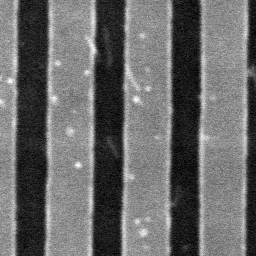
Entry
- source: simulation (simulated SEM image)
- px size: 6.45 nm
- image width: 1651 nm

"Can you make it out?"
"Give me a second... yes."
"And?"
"lines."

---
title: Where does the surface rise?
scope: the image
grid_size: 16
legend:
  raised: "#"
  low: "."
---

#..###..###..##.
#..###..###..##.
#..###..###..##.
#..###..###..##.
#..###..###..##.
#..###..###..##.
#..###..###..##.
#..###..###..##.
#..###..###..##.
#..###..###..##.
#..###..###..##.
#..###..###..##.
#..###..###..##.
#..###..###..##.
#..###..###..##.
#..###..###..##.